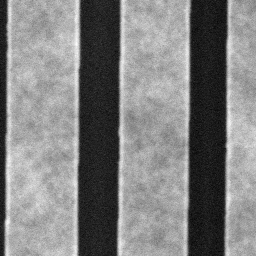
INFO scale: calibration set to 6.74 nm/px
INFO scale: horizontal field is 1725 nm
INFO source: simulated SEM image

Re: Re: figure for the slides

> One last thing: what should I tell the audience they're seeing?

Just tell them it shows lines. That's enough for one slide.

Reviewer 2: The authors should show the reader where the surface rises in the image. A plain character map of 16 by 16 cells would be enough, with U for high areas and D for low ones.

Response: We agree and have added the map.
DUUUUDDDUUUUDDUU
DUUUUDDDUUUUDDUU
DUUUUDDDUUUUDDUU
DUUUUDDDUUUUDDUU
DUUUUDDDUUUUDDUU
DUUUUDDDUUUUDDUU
DUUUUDDDUUUUDDUU
DUUUUDDUUUUUDDUU
UUUUUDDUUUUUDDUU
UUUUUDDUUUUUDDUU
UUUUUDDUUUUUDDUU
UUUUUDDUUUUUDDUU
UUUUUDDUUUUUDDUU
UUUUUDDUUUUUDDUU
UUUUUDDUUUUUDDUU
UUUUUDDUUUUUDDUU